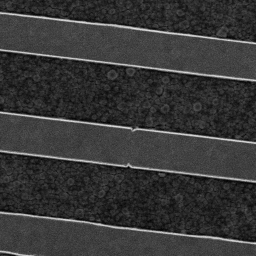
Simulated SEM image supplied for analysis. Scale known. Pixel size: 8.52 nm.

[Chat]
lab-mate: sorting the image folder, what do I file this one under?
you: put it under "one or a few lines or trenches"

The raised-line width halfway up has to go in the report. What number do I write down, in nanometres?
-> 319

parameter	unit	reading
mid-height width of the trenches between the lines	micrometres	0.524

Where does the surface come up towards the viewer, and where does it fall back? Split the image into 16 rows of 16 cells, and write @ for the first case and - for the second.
----------------
@@@@@@----------
@@@@@@@@@@@@@@--
---@@@@@@@@@@@@@
-----------@@@@@
----------------
----------------
@@@@------------
@@@@@@@@@@@@----
-@@@@@@@@@@@@@@@
---------@@@@@@@
----------------
----------------
@@--------------
@@@@@@@@@@------
@@@@@@@@@@@@@@@@